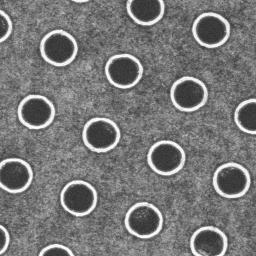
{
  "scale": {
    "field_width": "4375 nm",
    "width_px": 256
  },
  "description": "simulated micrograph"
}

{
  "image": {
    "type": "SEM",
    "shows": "a regular array of raised bodies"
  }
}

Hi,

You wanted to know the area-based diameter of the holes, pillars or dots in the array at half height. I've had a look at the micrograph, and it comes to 567 nanometers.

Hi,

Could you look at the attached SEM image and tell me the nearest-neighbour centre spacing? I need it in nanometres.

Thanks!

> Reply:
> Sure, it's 1160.